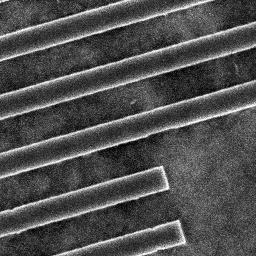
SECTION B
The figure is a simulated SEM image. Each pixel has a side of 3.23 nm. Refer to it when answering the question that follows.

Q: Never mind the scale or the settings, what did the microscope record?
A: parallel lines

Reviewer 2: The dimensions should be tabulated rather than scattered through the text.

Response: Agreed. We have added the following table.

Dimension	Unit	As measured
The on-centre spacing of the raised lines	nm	182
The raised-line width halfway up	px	23.5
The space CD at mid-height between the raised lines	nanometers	106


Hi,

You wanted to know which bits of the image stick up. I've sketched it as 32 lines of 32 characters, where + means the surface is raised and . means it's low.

..............+++++++++++.......
...........++++++++++...........
.......+++++++++++..............
....++++++++++...............+++
+++++++++++...............++++++
+++++++...............++++++++++
++++...............++++++++++...
...............+++++++++++......
............++++++++++..........
........+++++++++++.............
.....++++++++++...............++
.+++++++++++...............+++++
++++++++...............+++++++++
+++++...............+++++++++++.
+...............+++++++++++.....
.............+++++++++++........
.........+++++++++++............
......+++++++++++...............
..+++++++++++...................
++++++++++......................
++++++..........................
+++...............+++...........
..............+++++++...........
...........++++++++++...........
.......+++++++++++..............
....++++++++++..................
+++++++++++.....................
+++++++.........................
++++...............++++.........
...............++++++++.........
............+++++++++++.........
.........++++++++++.............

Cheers